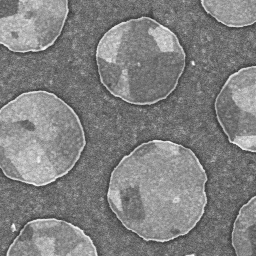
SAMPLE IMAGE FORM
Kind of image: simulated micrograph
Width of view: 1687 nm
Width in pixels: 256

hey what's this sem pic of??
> raised bodies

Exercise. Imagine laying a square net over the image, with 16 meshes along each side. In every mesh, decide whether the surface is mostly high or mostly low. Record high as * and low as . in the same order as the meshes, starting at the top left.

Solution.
****.........***
****....**....**
***...*****.....
......******....
......*****....*
.......****...**
****.........***
*****.........**
*****.........**
*****...****....
****...******...
..*....******...
.......******...
.......******..*
.****...****...*
.*****.........*